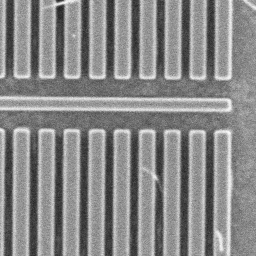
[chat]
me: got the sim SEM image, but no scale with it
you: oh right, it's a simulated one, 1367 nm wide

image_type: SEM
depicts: groups of lines, slits or small figures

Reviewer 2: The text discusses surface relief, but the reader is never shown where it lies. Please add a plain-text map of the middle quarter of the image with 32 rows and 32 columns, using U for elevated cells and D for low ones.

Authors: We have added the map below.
UUUUDDUUUUDDDUUUUDDUUUUDDUUUUDDD
UUUUDDUUUUDDDUUUUDDUUUUDDUUUUDDU
UUUUDDUUUUDDDUUUUDDUUUUDDUUUUDDU
DUUUDDDUUUDDDUUUDDDUUUUDDDUUUDDD
DDDDDDDDDDDDDDDDDDDDDDDDDDDDDDDD
DDDDDDDDDDDDDDDDDDDDDDDDDDDDDDDD
DDDDDDDDDDDDDDDDDDDDDDDDDDDDDDDD
DDDDDDDDDDDDDDDDDDDDDDDDDDDDDDDD
DDDDDDDDDDDDDDDDDDDDDDDDDDDDDDDD
UUUUUUUUUUUUUUUUUUUUUUUUUUUUUUUU
UUUUUUUUUUUUUUUUUUUUUUUUUUUUUUUU
DDDDUUUUUUUUUUUUUUUUUUUUUUUUUUUU
DDDDDDDDDDDDDDDDDDDDDDDDDDDDDDDD
DDDDDDDDDDDDDDDDDDDDDDDDDDDDDDDD
DDDDDDDDDDDDDDDDDDDDDDDDDDDDDDDD
DDDDDDDDDDDDDDDDDDDDDDDDDDDDDDDD
DDDDDDDDDDDDDDDDDDDDDDDDDDDDDDDD
UUUUDDUUUUDDDUUUDDDUUUUDDUUUUDDU
UUUUDDUUUUDDDUUUDDDUUUUDDUUUUDDU
UUUUDDUUUUDDDUUUDDDUUUUDDUUUUDDU
UUUUDDUUUUDDDUUUDDDUUUUDDUUUUDDU
UUUUDDUUUUDDDUUUDDDUUUUDDUUUUDDU
UUUUDDUUUUDDDUUUDDDUUUUDDUUUUDDU
UUUUDDUUUUDDDUUUDDDUUUUDDUUUUDDU
UUUUDDUUUUDDDUUUDDDUUUUDDUUUUDDU
UUUUDDUUUUDDUUUUDDDUUUUDDUUUUDDU
UUUUDDUUUUDDUUUUDDDUUUUDDUUUUDDU
UUUUDDUUUUDDUUUUDDDUUUUDDUUUUDDU
UUUUDDUUUUDDUUUUDDDUUUUDDUUUUDDU
UUUUDDUUUUDDUUUUDDDUUUUDDUUUUDDU
UUUUDDUUUUDDUUUUDDDUUUUDDUUUUDDU
UUUUDDUUUUDDUUUUDDDUUUUDDUUUUDDU